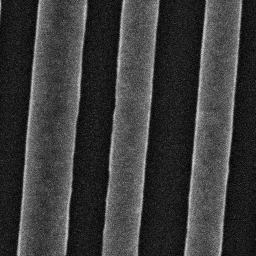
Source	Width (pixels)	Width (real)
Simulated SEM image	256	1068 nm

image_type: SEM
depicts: one or a few lines or trenches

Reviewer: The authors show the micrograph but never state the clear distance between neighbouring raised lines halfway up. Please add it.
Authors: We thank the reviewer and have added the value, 160 nanometers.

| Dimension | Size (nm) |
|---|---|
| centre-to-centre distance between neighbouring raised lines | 336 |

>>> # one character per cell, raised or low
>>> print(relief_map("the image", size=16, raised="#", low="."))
..###...##...##.
..###...##...##.
..###...##...##.
..###..###...##.
..###..###...##.
..###..##...###.
..###..##...###.
..###..##...##..
..###..##...##..
..###..##...##..
..###..##...##..
.###...##...##..
.###...##...##..
.###...##...##..
.###..###...##..
.###..###...##..